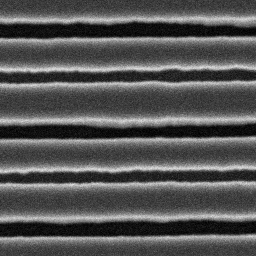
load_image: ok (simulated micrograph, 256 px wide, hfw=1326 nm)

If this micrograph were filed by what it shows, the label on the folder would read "lines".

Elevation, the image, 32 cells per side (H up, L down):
HHHHHHHHHHHHHHHHHHHHHHHHHHHHHHHH
HHHHHHHHHHHHHHHHHHHHHHHHHHHHHHHH
HHHHHHHHHHHHHHHHHHHHHHHHHHHHHHHH
LLLLLLLLLLLLLLLLLLLLLLLLLLLLLLLL
LLLLLLLLLLLLLLLLLLLLLLLLLLLLLLLL
HHHHHHHHHHHHHHHHHHHHHHHHHHHHHHHH
HHHHHHHHHHHHHHHHHHHHHHHHHHHHHHHH
HHHHHHHHHHHHHHHHHHHHHHHHHHHHHHHH
HHHHHHHHHHHHHHHHHHHHHHHHHHHHHHHH
HHHHHHHHHHHHHHHHHHHHHHHHHHHHHHHH
HHHHHHHHHHHHHHHHHHHHHHHHHHHHHHHH
HHHHHHHHHHHHHHHHHHHHHHHHHHHHHHHH
HHHHHHHHHHHHHHHHHHHHHHHHHHHHHHHH
HHHHHHHHHHHHHHHHHHHHHHHHHHHHHHHH
HHHHHHHHHHHHHHHHHHHHHHHHHHHHHHHH
LLLLLLLLLLLLLLLLLLLLLLLLLLLLLLLL
LLLLLLLLLLLLLLLLLLLLLLLLLLLLLLLL
LLLLLLLLLLLLLHHHHHHHHHHHHHHHHHHH
HHHHHHHHHHHHHHHHHHHHHHHHHHHHHHHH
HHHHHHHHHHHHHHHHHHHHHHHHHHHHHHHH
HHHHHHHHHHHHHHHHHHHHHHHHHHHHHHHH
HHHHHHHHHHHHHHHHHHHHHHHHHHHHHHHH
HHHHHHHHHHHHHHHHHHHHHHHHHHHHHHHH
HHHHHHHHHHHHHHHHHHHHHHHHHHHHHHHH
HHHHHHHHHHHHHHHHHHHHHHHHHHHHHHHH
HHHHHHHHHHHHHHHHHHHHHHHHHHHHHHHH
HHHHHHHHHHHHHHHHHHHHHHHHHHHHHHHH
HHLHLHHHHHLHHLLLLLLLLLLLLLLLLLLL
LLLLLLLLLLLLLLLLLLLLLLLLLLLLLLLL
LLLLLLLLLLLLLLLLLLLLLLLLLLHHLLHH
HHHHHHHHHHHHHHHHHHHHHHHHHHHHHHHH
HHHHHHHHHHHHHHHHHHHHHHHHHHHHHHHH